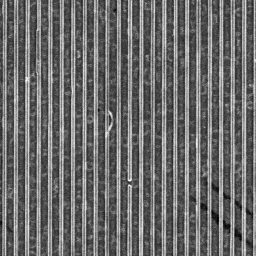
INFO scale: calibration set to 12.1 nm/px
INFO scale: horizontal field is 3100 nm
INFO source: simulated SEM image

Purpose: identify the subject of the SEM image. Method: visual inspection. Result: parallel lines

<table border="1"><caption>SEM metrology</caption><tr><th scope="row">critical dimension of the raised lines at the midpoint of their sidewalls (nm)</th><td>33.3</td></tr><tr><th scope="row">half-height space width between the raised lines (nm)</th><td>108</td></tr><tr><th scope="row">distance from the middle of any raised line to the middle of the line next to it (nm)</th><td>138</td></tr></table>